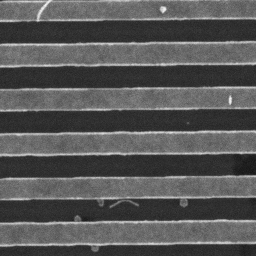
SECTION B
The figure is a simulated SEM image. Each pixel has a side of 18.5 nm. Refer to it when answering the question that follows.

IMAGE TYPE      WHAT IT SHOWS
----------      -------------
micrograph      lines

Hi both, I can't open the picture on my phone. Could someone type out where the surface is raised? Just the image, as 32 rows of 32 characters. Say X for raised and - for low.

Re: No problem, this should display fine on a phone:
XXXXXXXXXXXXXXXXXXXXXXXXXXXXXXXX
XXXXXXXXXXXXXXXXXXXXXXXXXXXXXXXX
XXXXXXXXXXXXX-------------------
--------------------------------
--------------------------------
----------XXXXXXXXXXXXXXXXXXXXXX
XXXXXXXXXXXXXXXXXXXXXXXXXXXXXXXX
XXXXXXXXXXXXXXXXXXXXXXXXXXXXXXXX
--------------------------------
--------------------------------
--------------------------------
XXXXXXXXXXXXXXXXXXXXXXXXXXXXXXXX
XXXXXXXXXXXXXXXXXXXXXXXXXXXXXXXX
XXXXXXXXXXXXXXXXXXXXXXXXXXXXXXXX
--------------------------------
--------------------------------
-------------------------XXXXXXX
XXXXXXXXXXXXXXXXXXXXXXXXXXXXXXXX
XXXXXXXXXXXXXXXXXXXXXXXXXXXXXXXX
--------------------------------
--------------------------------
--------------------------------
XXXXXXXXXXXXXXXXXXXXXXXXXXXXXXXX
XXXXXXXXXXXXXXXXXXXXXXXXXXXXXXXX
XXXXXXXXXXXXXXXXXXXXXXXXXXXXXXXX
--------------------------------
--------------------------------
---------------------------XX---
XXXXXXXXXXXXXXXXXXXXXXXXXXXXXXXX
XXXXXXXXXXXXXXXXXXXXXXXXXXXXXXXX
XXXXXXXXXXXXXXXXXXXXXX----------
--------------------------------